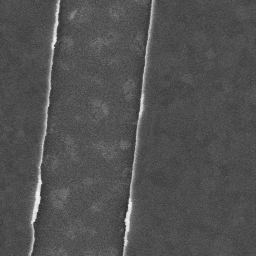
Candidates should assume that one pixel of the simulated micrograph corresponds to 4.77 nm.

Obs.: one or a few lines or trenches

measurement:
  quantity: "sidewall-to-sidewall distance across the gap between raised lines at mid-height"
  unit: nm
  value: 438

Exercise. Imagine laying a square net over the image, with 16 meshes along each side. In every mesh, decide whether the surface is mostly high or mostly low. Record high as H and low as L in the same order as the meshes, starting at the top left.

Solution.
HHHHLLLLLHHHHHHH
HHHHLLLLLHHHHHHH
HHHLLLLLLHHHHHHH
HHHLLLLLLHHHHHHH
HHHLLLLLLHHHHHHH
HHHLLLLLLHHHHHHH
HHHLLLLLLHHHHHHH
HHHLLLLLLHHHHHHH
HHHLLLLLLHHHHHHH
HHHLLLLLHHHHHHHH
HHHLLLLLHHHHHHHH
HHHLLLLLHHHHHHHH
HHLLLLLLHHHHHHHH
HHLLLLLLHHHHHHHH
HHLLLLLLHHHHHHHH
HHLLLLLLHHHHHHHH